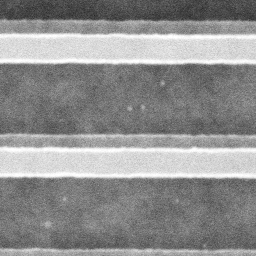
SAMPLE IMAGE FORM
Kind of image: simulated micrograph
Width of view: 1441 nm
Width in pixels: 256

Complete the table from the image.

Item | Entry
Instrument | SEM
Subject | lines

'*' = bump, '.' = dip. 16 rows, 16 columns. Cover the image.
................
****************
****************
****************
................
................
................
................
***.*******.....
****************
****************
................
................
................
................
................